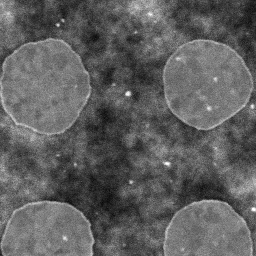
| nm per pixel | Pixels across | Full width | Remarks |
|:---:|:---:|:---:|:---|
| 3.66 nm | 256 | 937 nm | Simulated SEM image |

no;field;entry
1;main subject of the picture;raised bodies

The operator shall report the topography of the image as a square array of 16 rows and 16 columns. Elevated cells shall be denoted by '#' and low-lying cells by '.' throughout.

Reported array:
................
................
...#........#...
.####......####.
#####.....######
######....######
#####......####.
.####......###..
................
................
................
................
................
.####......####.
######....######
######....######